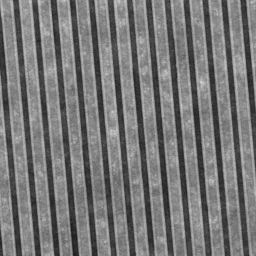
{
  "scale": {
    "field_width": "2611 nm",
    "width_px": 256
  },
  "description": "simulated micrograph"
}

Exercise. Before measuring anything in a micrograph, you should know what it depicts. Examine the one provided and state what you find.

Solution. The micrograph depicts parallel lines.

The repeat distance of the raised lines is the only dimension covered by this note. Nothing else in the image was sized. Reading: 18.9 px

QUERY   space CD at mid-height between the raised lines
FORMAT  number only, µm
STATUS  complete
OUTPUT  0.085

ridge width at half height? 105 nanometres